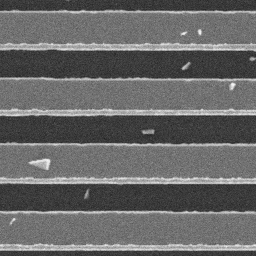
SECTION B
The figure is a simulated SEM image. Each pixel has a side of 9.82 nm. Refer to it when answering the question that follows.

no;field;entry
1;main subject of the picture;lines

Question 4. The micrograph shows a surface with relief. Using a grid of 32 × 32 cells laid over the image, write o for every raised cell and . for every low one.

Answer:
................................
oooooooooooooooooooooooooooooooo
oooooooooooooooooooooooooooooooo
oooooooooooooooooooooooooooooooo
oooooooooooooooooooooooooooooooo
oooooooooooooooooooooooooooooooo
................................
................................
................................
................................
oooooooooooooooooooooooooooooooo
oooooooooooooooooooooooooooooooo
oooooooooooooooooooooooooooooooo
oooooooooooooooooooooooooooooooo
................................
................................
................................
................................
oooooooooooooooooooooooooooooooo
oooooooooooooooooooooooooooooooo
oooooooooooooooooooooooooooooooo
oooooooooooooooooooooooooooooooo
oooooooooooooooooooooooooooooooo
................................
................................
................................
ooooo.ooooooooooooooo..oo...oo..
oooooooooooooooooooooooooooooooo
oooooooooooooooooooooooooooooooo
oooooooooooooooooooooooooooooooo
oooooooooooooooooooooooooooooooo
................................